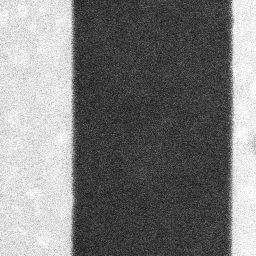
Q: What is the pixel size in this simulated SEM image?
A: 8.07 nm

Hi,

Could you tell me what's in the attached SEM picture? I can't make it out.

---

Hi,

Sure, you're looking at one or a few lines or trenches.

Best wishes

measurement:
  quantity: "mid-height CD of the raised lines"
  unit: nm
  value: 1330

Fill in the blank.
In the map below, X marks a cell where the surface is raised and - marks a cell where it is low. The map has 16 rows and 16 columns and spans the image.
----XXXXXXXXXXX-
----XXXXXXXXXXX-
----XXXXXXXXXXX-
----XXXXXXXXXXX-
----XXXXXXXXXXX-
----XXXXXXXXXXX-
----XXXXXXXXXXX-
----XXXXXXXXXXX-
----XXXXXXXXXXX-
----XXXXXXXXXXX-
----XXXXXXXXXXX-
----XXXXXXXXXXX-
----XXXXXXXXXXX-
----XXXXXXXXXXX-
----XXXXXXXXXXX-
----XXXXXXXXXXX-